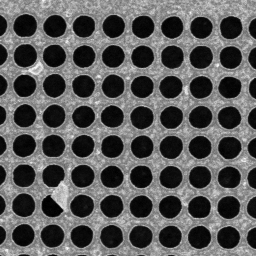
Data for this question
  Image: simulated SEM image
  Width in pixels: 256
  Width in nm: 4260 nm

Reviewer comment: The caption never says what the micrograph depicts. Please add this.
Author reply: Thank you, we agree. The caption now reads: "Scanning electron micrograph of a regular array of holes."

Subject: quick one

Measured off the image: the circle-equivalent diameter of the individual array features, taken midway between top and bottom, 386 nm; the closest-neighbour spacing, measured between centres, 484 nanometres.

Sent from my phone